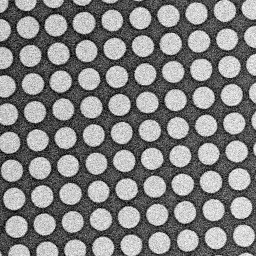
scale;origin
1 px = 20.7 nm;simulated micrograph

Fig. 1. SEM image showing an array of small figures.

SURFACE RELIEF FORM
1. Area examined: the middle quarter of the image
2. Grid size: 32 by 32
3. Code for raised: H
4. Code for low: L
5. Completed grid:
LLLLLLLLLLLLLLLLLLLHHHLLLHHHHHLL
LLLLLHHHLLLHHHHLLLHHHHHLLHHHHHLL
HLLLHHHHHLLHHHHHLLHHHHHLLHHHHHLL
HHLLHHHHHLLHHHHHLLHHHHHLLHHHHHLL
HHLLHHHHHLLHHHHHLLHHHHLLLLLHLLLL
HHLLHHHHLLLLHHHLLLLLLLLLLLLLLLLL
HLLLLLLLLLLLLLLLLLLLLLLLLLLHHLLL
LLLLLLLLLLLLLLLLLLLHHHLLLLHHHHLL
LLLLLLHHLLLLHHHHLLHHHHHLLHHHHHLL
HHLLLHHHHLLHHHHHLLHHHHHHLHHHHHLL
HHLLHHHHHLLHHHHHLLHHHHHLLLHHHHLL
HHLLHHHHHLLLHHHHLLLHHHHLLLLHHLLL
HHLLLHHHHLLLHHHLLLLLLLLLLLLLLLLL
HLLLLLLLLLLLLLLLLLLLLLLLLLLLHLLL
LLLLLLLLLLLLLLLLLLLLHHHLLLHHHHHL
LLLLLLHHHLLLLHHHHLLHHHHHLLHHHHHL
HHLLLHHHHHLLHHHHHLLHHHHHLLHHHHHL
HHHLLHHHHHLLHHHHHLLHHHHHLLHHHHHL
HHHLLHHHHHLLHHHHHLLLHHHLLLLHHLLL
HHHLLHHHHHLLLHHHLLLLLLLLLLLLLLLL
HHLLLLLLLLLLLLLLLLLLLLLLLLLLLHLL
LLLLLLLLLLLLLLLLLLLLHHHHLLLHHHHL
LLLLLLLHHLLLLHHHHLLLHHHHLLLHHHHH
HHHLLLHHHHLLHHHHHHLHHHHHHLHHHHHH
HHHLLLHHHHHLHHHHHHLHHHHHHLLHHHHL
HHHHLLHHHHHLLHHHHLLLHHHHLLLLHHLL
HHHLLLHHHHLLLLHHHLLLLLLLLLLLLLLL
HHHLLLLHHLLLLLLLLLLLLLLLLLLLLLLL
LLLLLLLLLLLLLLLLLLLLLHHHLLLLHHHH
LLLLLLLLHHLLLLHHHHLLHHHHHLLHHHHH
HHHLLLHHHHHLLHHHHHLLHHHHHLLHHHHH
HHHHLLHHHHHLLHHHHHLLHHHHHLLHHHHH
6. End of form